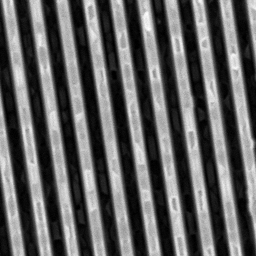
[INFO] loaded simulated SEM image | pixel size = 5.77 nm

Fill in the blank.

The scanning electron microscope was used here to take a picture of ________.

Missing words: parallel lines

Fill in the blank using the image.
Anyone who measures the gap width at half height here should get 82.7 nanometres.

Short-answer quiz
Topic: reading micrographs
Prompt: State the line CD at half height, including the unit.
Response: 0.0727 microns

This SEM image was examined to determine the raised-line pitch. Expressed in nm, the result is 155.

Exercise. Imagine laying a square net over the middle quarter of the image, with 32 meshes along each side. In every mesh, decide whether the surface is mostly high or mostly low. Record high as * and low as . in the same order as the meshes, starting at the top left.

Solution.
***....***....***....***....***.
.***...***....***....***....***.
.***...****...***....***....***.
.***....***...****...***....***.
.***....***....***...***....***.
.***....***....***....***...***.
.***....***....***....***....***
..**....***....***....***....***
..***...***....***....***....***
..***....***...***....***....***
..***....***...****...***....***
..***....***....***...****...***
..***....***....***....***...***
..***....***....***....***....**
...**....***....***....***....**
...***...***....***....***....**
...***....***...***....***....**
...***....***....***...***....**
...***....***....***....***...**
...***....***....***....***....*
....**....***....***....***....*
....***...***....***....***....*
....***...****...***....***....*
....***....***...****...***....*
....***....***....***...****...*
*...***....***....***....***...*
*...***....***....***....***....
*....**....***....***....***....
*....***...***....***....***....
*....***....***...***....***....
*....***....***....***...***....
*....***....***....***...****...